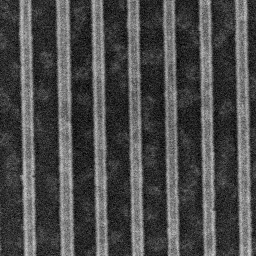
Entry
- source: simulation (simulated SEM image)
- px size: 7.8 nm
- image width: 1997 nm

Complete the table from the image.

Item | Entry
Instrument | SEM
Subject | parallel lines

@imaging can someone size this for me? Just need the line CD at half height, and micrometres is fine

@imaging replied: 0.0722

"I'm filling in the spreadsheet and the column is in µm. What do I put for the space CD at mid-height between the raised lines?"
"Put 0.208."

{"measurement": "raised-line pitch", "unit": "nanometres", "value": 280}